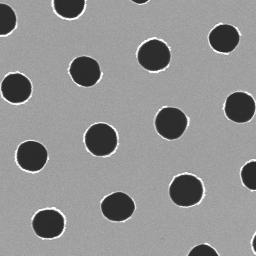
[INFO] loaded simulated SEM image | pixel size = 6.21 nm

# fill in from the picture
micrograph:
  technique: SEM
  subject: a regular array of holes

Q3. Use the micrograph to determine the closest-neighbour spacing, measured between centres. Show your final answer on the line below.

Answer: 0.432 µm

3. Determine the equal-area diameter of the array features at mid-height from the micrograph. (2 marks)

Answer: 186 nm